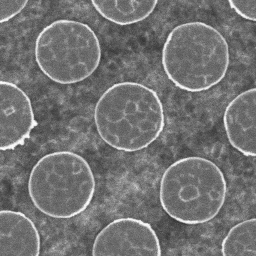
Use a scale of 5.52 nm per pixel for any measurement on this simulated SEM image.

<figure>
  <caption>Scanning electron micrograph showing raised bodies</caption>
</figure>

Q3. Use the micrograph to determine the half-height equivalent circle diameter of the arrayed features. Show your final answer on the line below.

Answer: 66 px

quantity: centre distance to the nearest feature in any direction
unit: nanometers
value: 495